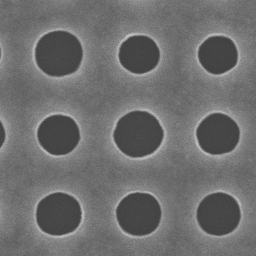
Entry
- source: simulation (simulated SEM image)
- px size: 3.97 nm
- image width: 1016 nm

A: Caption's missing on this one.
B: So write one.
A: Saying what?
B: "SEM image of a regular array of holes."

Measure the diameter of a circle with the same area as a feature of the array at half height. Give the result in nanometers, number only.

174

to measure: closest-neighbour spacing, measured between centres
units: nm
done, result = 315